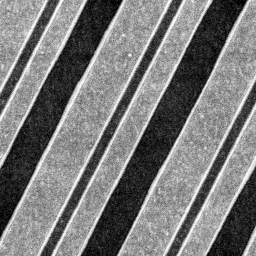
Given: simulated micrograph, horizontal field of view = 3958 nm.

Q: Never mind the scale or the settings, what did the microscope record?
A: lines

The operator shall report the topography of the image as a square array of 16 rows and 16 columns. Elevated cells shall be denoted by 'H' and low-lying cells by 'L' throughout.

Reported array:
HHHHHLLLHHHHHLLH
HHHHHLLHHHHHLLLH
HHHHLLHHHHHHLLHH
HHHHLLHHHHHLLLHH
HHHLLHHHHHHLLHHH
HHHLLHHHHHLLLHHH
HHLLHHHHHHLLHHHH
HLLLHHHHHLLLHHHH
HLLHHHHHHLLHHHHH
LLLHHHHHLLLHHHHH
LLHHHHHHLLHHHHHH
LLHHHHHLLLHHHHHL
LHHHHHHLLHHHHHHL
LHHHHHLLLHHHHHLL
HHHHHHLLHHHHHHLL
HHHHHLLLHHHHHLLL